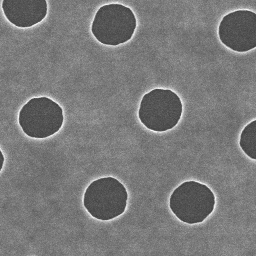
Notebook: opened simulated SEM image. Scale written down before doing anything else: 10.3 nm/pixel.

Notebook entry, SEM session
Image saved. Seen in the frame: holes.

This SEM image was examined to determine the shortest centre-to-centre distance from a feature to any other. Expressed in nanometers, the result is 1010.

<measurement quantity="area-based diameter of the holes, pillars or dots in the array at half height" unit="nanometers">445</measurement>